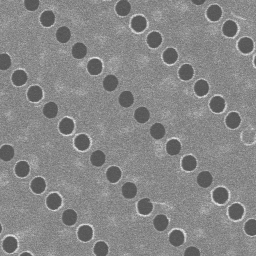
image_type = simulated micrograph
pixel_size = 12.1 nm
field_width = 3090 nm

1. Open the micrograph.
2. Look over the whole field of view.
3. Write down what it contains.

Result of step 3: a regular array of holes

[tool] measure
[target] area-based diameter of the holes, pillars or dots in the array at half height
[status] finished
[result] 196 nm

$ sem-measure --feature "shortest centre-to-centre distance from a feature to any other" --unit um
0.27